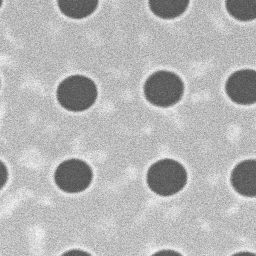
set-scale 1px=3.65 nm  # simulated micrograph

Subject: holes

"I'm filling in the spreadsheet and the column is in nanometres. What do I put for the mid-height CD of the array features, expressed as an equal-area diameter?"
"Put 143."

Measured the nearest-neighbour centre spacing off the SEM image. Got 0.309 microns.